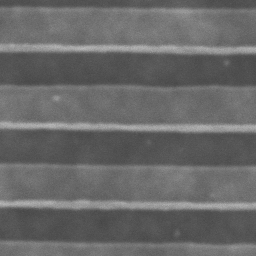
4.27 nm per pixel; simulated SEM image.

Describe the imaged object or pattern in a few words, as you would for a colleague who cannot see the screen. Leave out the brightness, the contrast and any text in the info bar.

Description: lines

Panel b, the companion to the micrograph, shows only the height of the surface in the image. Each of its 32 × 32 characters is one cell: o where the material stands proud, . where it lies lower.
................................
oooooooooooooooooooooooooooooooo
oooooooooooooooooooooooooooooooo
oooooooooooooooooooooooooooooooo
oooooooooooooooooooooooooooooooo
oooooooooooooooooooooooooooooooo
.....................ooooooooooo
................................
................................
................................
................................
oooooooooooooooooooooooooooooooo
oooooooooooooooooooooooooooooooo
oooooooooooooooooooooooooooooooo
oooooooooooooooooooooooooooooooo
oooooooooooooooooooooooooooooooo
................................
................................
................................
................................
................................
oooooooooooooooooooooooooooooooo
oooooooooooooooooooooooooooooooo
oooooooooooooooooooooooooooooooo
oooooooooooooooooooooooooooooooo
oooooooooooooooooooooooooooooooo
................................
................................
................................
................................
oooooooooo......................
oooooooooooooooooooooooooooooooo